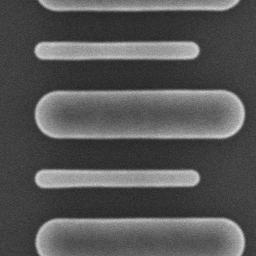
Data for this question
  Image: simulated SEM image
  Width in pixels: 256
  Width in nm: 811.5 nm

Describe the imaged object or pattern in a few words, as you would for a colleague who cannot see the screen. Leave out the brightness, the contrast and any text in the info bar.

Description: groups of lines, slits or small figures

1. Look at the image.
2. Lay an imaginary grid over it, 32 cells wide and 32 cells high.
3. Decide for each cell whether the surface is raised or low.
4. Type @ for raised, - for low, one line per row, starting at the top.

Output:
-----@@@@@@@@@@@@@@@@@@@@@@@@---
--------------------------------
--------------------------------
--------------------------------
--------------------------------
-----@@@@@@@@@@@@@@@@@@@--------
----@@@@@@@@@@@@@@@@@@@@@-------
--------------------------------
--------------------------------
--------------------------------
--------------------------------
-------------@@@@@@@@@@@@@@@----
-----@@@@@@@@@@@@@@@@@@@@@@@@@--
-----@@@@@@@@@@@@@@@@@@@@@@@@@--
----@@@@@@@@@@@@@@@@@@@@@@@@@@--
-----@@@@@@@@@@@@@@@@@@@@@@@@@--
------@@@@@@@@@@@@@@@@@@@@@@@---
--------------------------------
--------------------------------
--------------------------------
--------------------------------
-----@@@@@@@@@@@@@@@@@@@--------
-----@@@@@@@@@@@@@@@@@@@@-------
--------------------------------
--------------------------------
--------------------------------
--------------------------------
-------@@@@@--@@@@@@@@@@@@@@----
-----@@@@@@@@@@@@@@@@@@@@@@@@@--
-----@@@@@@@@@@@@@@@@@@@@@@@@@--
-----@@@@@@@@@@@@@@@@@@@@@@@@@--
-----@@@@@@@@@@@@@@@@@@@@@@@@@--